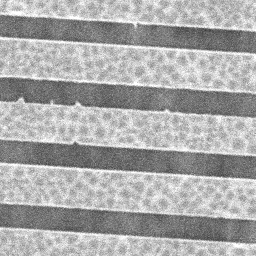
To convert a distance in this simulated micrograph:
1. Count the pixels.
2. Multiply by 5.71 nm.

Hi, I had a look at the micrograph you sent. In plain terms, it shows one or a few lines or trenches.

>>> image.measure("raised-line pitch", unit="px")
62.7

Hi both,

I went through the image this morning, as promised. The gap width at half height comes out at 144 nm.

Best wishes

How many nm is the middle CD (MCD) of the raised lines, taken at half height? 214